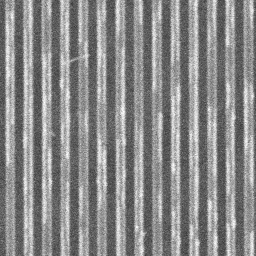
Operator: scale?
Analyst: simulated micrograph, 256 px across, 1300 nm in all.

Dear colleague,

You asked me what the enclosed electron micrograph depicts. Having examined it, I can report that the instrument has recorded parallel lines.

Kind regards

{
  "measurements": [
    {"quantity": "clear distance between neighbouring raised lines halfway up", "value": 52.7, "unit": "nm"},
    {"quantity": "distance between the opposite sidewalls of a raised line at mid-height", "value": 0.0387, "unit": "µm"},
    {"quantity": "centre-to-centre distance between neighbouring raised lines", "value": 0.0932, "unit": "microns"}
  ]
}